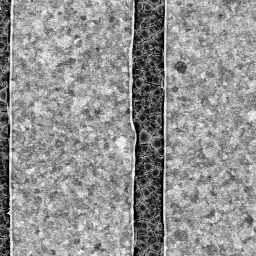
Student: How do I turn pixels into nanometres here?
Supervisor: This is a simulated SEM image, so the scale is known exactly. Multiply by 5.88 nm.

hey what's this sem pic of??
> one or a few lines or trenches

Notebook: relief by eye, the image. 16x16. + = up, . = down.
.+++++++..++++++
.+++++++..++++++
.+++++++..++++++
.+++++++..++++++
.+++++++..++++++
.+++++++..++++++
.+++++++..++++++
.+++++++..++++++
.++++++++.++++++
.+++++++..++++++
.+++++++..++++++
.+++++++..++++++
.+++++++..++++++
.+++++++..++++++
.+++++++..++++++
.+++++++..++++++